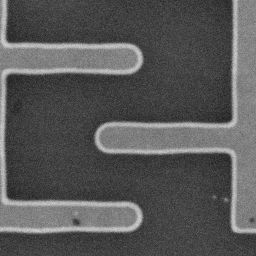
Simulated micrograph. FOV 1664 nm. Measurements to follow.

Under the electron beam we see groups of lines, slits or small figures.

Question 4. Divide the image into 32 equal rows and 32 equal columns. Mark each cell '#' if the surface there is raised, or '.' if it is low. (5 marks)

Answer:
#............................###
#............................###
#............................###
#............................###
.............................###
#............................###
#################............###
##################...........###
#################............###
#............................###
.............................###
.............................###
.............................###
.............................###
.............................###
.............................###
............####################
............####################
.............###################
.............................###
.............................###
.............................###
.............................###
.............................###
#............................###
#########....................###
#################............###
#################............###
#################............###
................................
................................
................................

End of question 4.